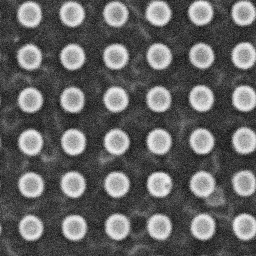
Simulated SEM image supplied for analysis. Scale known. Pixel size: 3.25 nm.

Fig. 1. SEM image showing a regular array of raised bodies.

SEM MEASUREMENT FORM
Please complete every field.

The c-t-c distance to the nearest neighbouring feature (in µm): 0.138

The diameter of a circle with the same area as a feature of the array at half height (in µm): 0.0749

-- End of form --